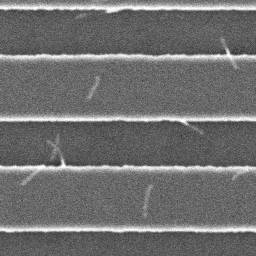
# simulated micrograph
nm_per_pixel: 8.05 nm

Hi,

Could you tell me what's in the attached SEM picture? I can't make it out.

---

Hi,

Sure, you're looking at lines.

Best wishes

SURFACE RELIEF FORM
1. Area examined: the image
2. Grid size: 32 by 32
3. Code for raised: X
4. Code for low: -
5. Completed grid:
XXXXXXXXXXXXXXXXXXXXXXXXXXXXXXXX
--------------------------------
--------------------------------
--------------------------------
--------------------------------
--------------------------------
--------------------------------
XXXXXXXXXXXXXXXXXXXXXXXXXXXXXXXX
XXXXXXXXXXXXXXXXXXXXXXXXXXXXXXXX
XXXXXXXXXXXXXXXXXXXXXXXXXXXXXXXX
XXXXXXXXXXXXXXXXXXXXXXXXXXXXXXXX
XXXXXXXXXXXXXXXXXXXXXXXXXXXXXXXX
XXXXXXXXXXXXXXXXXXXXXXXXXXXXXXXX
XXXXXXXXXXXXXXXXXXXXXXXXXXXXXXXX
XXXXXXXXXXXXXXXXXXXXXXXXXXXXXXXX
--------------------------------
--------------------------------
--------------------------------
--------------------------------
--------------------------------
--------------------------------
XXXXXXXXXXXXXXXXXXXXXXXXXXXXXXXX
XXXXXXXXXXXXXXXXXXXXXXXXXXXXXXXX
XXXXXXXXXXXXXXXXXXXXXXXXXXXXXXXX
XXXXXXXXXXXXXXXXXXXXXXXXXXXXXXXX
XXXXXXXXXXXXXXXXXXXXXXXXXXXXXXXX
XXXXXXXXXXXXXXXXXXXXXXXXXXXXXXXX
XXXXXXXXXXXXXXXXXXXXXXXXXXXXXXXX
XXXXXXXXXXXXXXXXXXXXXXXXXXXXXXXX
--------------------------------
--------------------------------
--------------------------------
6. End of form